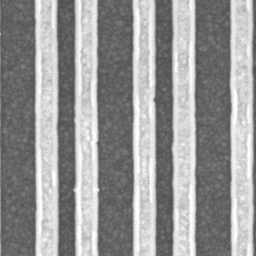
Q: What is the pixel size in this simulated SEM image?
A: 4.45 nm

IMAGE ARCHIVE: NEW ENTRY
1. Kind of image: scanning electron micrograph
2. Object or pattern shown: parallel lines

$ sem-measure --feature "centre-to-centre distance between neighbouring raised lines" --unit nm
217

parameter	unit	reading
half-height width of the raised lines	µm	0.08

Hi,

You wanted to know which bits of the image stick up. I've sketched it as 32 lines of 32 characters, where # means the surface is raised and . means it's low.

.....##...##.....##...##.....##.
.....##...##.....##...##.....##.
.....##...##.....##...##.....##.
.....##...##.....##...##.....##.
.....##...##.....##...##.....##.
.....##...##.....##...##.....##.
.....##...##.....##...##.....##.
.....##...##.....##...##.....##.
.....##...##.....##...##.....##.
.....##...##.....##...##.....##.
.....##...##.....##...##.....##.
.....##...##.....##...##.....##.
.....##...##.....##...##.....##.
.....##...##.....##...##.....##.
.....##...##.....##...##.....##.
.....##...##.....##...##.....##.
.....##...##.....##...##.....##.
.....##...##.....##...##.....##.
.....##...##.....##...##.....##.
.....##...##.....##...##.....##.
.....##...##.....##...##.....##.
.....##...##.....##...##.....##.
.....##...##.....##...##.....##.
.....##...##.....##...##.....##.
.....##...##.....##...##.....##.
.....##...##.....##...##.....##.
.....##...##.....##...##.....##.
.....##...##.....##...##.....##.
.....##...##.....##...##.....##.
.....##...##.....##...##.....##.
.....##...##.....##...##.....##.
.....##...##.....##...##.....##.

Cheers